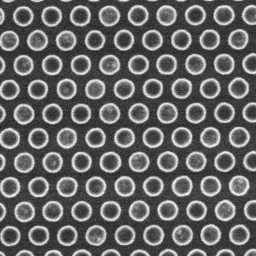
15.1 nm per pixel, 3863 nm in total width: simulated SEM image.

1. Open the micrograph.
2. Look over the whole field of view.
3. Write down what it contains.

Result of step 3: a regular array of raised bodies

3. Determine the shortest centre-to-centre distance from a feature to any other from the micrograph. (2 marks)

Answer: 422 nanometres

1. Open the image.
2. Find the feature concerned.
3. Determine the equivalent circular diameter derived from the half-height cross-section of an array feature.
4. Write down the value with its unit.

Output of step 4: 19.5 pixels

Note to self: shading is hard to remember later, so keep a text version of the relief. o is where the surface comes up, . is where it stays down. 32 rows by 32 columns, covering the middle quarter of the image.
..ooooo..ooooo..ooooo..ooooo...o
..oooo...oooo....oooo...oooo...o
...........o....................
................................
oo....ooo....oooo....ooo....ooo.
ooo...oooo...oooo...ooooo..ooooo
ooo..ooooo...oooo...ooooo..ooooo
ooo...oooo...oooo...oooo...oooo.
oo............oo................
................................
...ooo....ooo....ooo....ooo....o
..oooo...ooooo..ooooo...oooo...o
..oooo...ooooo..ooooo..ooooo...o
..oooo...ooooo...oooo...oooo...o
...oo.....ooo.....oo.....o......
................................
oo.....oo.....ooo....ooo....ooo.
ooo...oooo...oooo...ooooo..ooooo
ooo...oooo...ooooo..ooooo..ooooo
ooo...oooo...oooo...oooo...oooo.
oo.....oo.....oo.....oo.....ooo.
................................
...ooo....ooo.....oo....oooo....
..ooooo..ooooo..ooooo...oooo...o
..ooooo..ooooo..ooooo..ooooo...o
..ooooo..ooooo...oooo...oooo...o
...ooo....ooo....ooo.....oo.....
................................
.......oo.....oo.....ooo.....oo.
ooo...oooo...oooo...oooo....oooo
ooo...oooo...ooooo..ooooo..ooooo
ooo...oooo...oooo...oooo...ooooo